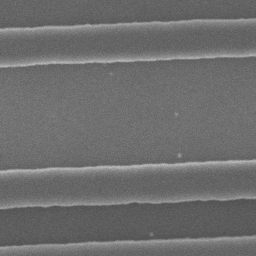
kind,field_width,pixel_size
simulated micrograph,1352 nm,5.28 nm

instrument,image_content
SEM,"lines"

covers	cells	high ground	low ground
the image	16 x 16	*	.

................
.......*********
****************
****************
................
................
................
................
................
................
.....***********
****************
**************..
................
................
****************